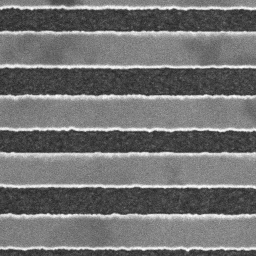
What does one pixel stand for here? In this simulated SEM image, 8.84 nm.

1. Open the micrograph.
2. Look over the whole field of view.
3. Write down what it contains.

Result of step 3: lines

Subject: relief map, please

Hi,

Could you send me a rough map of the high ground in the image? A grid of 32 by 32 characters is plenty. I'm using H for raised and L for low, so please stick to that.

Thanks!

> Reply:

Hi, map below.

HHHHHHHHHHHHHHHHHHHHHHHHHHHHHHHH
LLLLLLLLLLLLLLLLLLLLLLLLLLLLLLLL
LLLLLLLLLLLLLLLLLLLLLLLLLLLLLLLL
LLLLLLLLLLLLLLLLLLLLLLLLLLLLLLLL
HHHHHHHHHHHHHHHHHHHHHHHHHHHHHHHH
HHHHHHHHHHHHHHHHHHHHHHHHHHHHHHHH
HHHHHHHHHHHHHHHHHHHHHHHHHHHHHHHH
HHHHHHHHHHHHHHHHHHHHHHHHHHHHHHHH
LLLLLLLLLLLLLLLLLLLLLLLLLLLLLLLL
LLLLLLLLLLLLLLLLLLLLLLLLLLLLLLLL
LLLLLLLLLLLLLLLLLLLLLLLLLLLLLLLL
LLLLLLLLLLLLLLLLLLLLLLLLLLLLLLLL
HHHHHHHHHHHHHHHHHHHHHHHHHHHHHHHH
HHHHHHHHHHHHHHHHHHHHHHHHHHHHHHHH
HHHHHHHHHHHHHHHHHHHHHHHHHHHHHHHH
HHHHHHHHHHHHHHHHHHHHHHHHHHHHHHHH
LLLLLLLLLLLLLLLLLLLLLLLLLLLLLLLL
LLLLLLLLLLLLLLLLLLLLLLLLLLLLLLLL
LLLLLLLLLLLLLLLLLLLLLLLLLLLLLLLL
HHHHHHHHHHHHHHHHHHHHHHHHHHHHHHHH
HHHHHHHHHHHHHHHHHHHHHHHHHHHHHHHH
HHHHHHHHHHHHHHHHHHHHHHHHHHHHHHHH
HHHHHHHHHHHHHHHHHHHHHHHHHHHHHHHH
LLLLLLLLLLLLLLLLLLLLLLLLLLLLLLLL
LLLLLLLLLLLLLLLLLLLLLLLLLLLLLLLL
LLLLLLLLLLLLLLLLLLLLLLLLLLLLLLLL
LLLLLLLLLLLLLLLLLLLLLLLLLLLLLLLL
HHHHHHHHHHHHHHHHHHHHHHHHHHHHHHHH
HHHHHHHHHHHHHHHHHHHHHHHHHHHHHHHH
HHHHHHHHHHHHHHHHHHHHHHHHHHHHHHHH
HHHHHHHHHHHHHHHHHHHHHHHHHHHHHHHH
LLLLLLLLLLLLLLLLLLLLLLLLLLLLLLLL